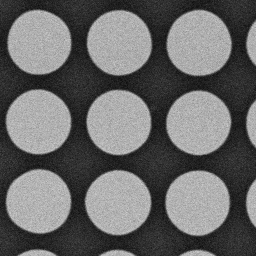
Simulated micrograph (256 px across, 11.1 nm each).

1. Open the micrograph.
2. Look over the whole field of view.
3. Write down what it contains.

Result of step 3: an array of small figures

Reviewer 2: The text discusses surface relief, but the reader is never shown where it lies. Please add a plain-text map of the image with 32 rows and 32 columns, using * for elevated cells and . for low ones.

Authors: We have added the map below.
................................
....**........**........**......
..******....******....******....
.*******...*******...*******...*
.********..********..********..*
.********..********..********..*
.********..********..********..*
..******....******...*******...*
...****......****.....******....
................................
................................
...***.......***........**......
..******....******....******....
.*******...*******...*******...*
.********..********..********..*
.********..********..********..*
.********..********..********..*
..******....******...*******...*
..*****.....*****.....*****.....
................................
................................
....**........**........**......
..******....******....******....
.*******...*******...*******...*
.********..********..********..*
.********..********..********..*
.********..********..*******...*
..******...*******...*******...*
...****.....*****.....*****.....
................................
................................
...***.......***........**......